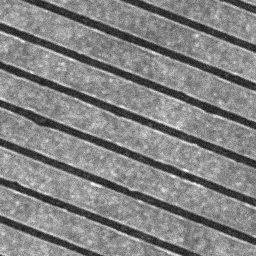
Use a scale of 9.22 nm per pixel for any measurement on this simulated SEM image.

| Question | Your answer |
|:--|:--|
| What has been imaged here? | parallel lines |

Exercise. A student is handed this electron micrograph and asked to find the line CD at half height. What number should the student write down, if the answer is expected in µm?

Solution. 0.251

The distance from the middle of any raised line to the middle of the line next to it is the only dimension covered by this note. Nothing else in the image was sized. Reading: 35.9 px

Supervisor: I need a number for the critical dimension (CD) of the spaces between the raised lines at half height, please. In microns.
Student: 0.0751